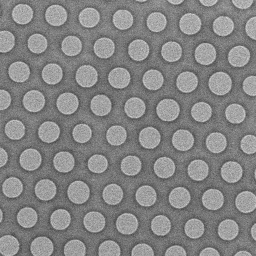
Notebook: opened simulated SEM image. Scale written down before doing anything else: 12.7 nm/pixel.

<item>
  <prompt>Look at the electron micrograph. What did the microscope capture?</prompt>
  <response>an array of small figures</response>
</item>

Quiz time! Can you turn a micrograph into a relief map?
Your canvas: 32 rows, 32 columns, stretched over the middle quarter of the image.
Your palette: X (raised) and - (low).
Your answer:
-----X--------------------------
---XXXXX----XXX-----------------
---XXXXX---XXXXX----XXXX-----XXX
---XXXXX---XXXXX----XXXXX---XXXX
---XXXXX---XXXXX----XXXXX---XXXX
-----XX-----XXX-----XXXX----XXXX
-----------------------------XXX
XX------------------------------
XXX----XXXX---------------------
XXX----XXXXX----XXXX----XXXX----
XXX----XXXXX---XXXXX---XXXXXX---
XXX----XXXX----XXXXX---XXXXXX---
--------XXX-----XXXX---XXXXXX---
------------------------XXXX----
--------------------------------
---XXX--------------------------
--XXXXX----XXXX-----XXX---------
--XXXXX----XXXX----XXXXX----XXXX
---XXX-----XXXX----XXXXX---XXXXX
----X------XXXX----XXXXX---XXXXX
--------------------XXX-----XXXX
-----------------------------X--
X-------------------------------
XX-----XXX-----XXX------XX------
XX----XXXXX----XXXX----XXXX-----
XX----XXXXX---XXXXX----XXXXX---X
XX-----XXX-----XXXX----XXXXX---X
---------------XXX-----XXXX----X
--------------------------------
---XX---------------------------
-XXXXX-----XXX------------------
-XXXXX----XXXX-----XXXX----XXXX-